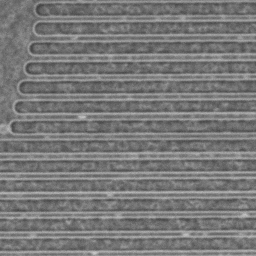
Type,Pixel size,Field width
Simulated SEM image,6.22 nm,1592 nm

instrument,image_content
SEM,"parallel lines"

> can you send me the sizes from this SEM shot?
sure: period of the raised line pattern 122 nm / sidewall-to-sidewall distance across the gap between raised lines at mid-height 84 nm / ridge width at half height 38.9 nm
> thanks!